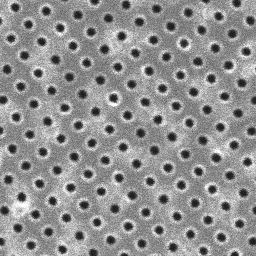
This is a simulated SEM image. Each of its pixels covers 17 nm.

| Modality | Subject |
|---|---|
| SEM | a regular array of holes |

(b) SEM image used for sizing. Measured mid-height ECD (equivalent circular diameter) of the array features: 171 nm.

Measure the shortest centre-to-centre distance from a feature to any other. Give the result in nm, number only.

372